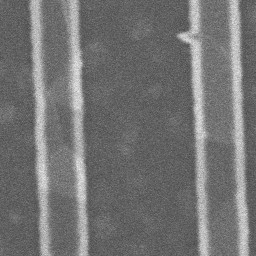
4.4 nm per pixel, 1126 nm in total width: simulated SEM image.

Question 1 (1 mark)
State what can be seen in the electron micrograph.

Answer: one or a few lines or trenches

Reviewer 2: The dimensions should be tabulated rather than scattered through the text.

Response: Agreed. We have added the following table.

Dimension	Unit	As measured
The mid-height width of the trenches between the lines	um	0.531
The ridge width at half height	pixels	38.8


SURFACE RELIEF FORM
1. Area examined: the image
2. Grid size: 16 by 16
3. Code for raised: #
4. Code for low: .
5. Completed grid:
..###.......###.
..###.......###.
..###.......###.
..###.......###.
..###.......###.
..###.......###.
...##.......###.
...##.......###.
..###........##.
...##........##.
...##........##.
...##........##.
...##........##.
...##........##.
...##........##.
...##........##.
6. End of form